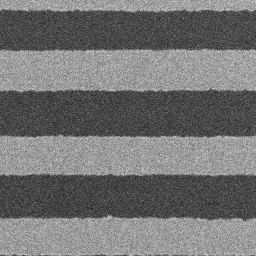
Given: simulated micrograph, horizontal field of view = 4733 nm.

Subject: one or a few lines or trenches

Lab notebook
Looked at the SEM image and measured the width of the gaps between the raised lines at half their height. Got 830 nanometres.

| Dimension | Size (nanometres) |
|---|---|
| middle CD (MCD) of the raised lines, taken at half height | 691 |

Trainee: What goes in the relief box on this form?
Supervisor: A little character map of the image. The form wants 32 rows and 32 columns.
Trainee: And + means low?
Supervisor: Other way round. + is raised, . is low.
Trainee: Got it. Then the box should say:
++++++++++++++++++++++++++++++++
................................
................................
................................
................................
................................
++++++++++++++++++++++++++++++++
++++++++++++++++++++++++++++++++
++++++++++++++++++++++++++++++++
++++++++++++++++++++++++++++++++
++++++++++++++++++++++++++++++++
................................
................................
................................
................................
................................
................................
++++++++++++++++++++++++++++++++
++++++++++++++++++++++++++++++++
++++++++++++++++++++++++++++++++
++++++++++++++++++++++++++++++++
++++++++++++++++++++++++++++++++
................................
................................
................................
................................
................................
++++++++++++++++++++++++++.+++.+
++++++++++++++++++++++++++++++++
++++++++++++++++++++++++++++++++
++++++++++++++++++++++++++++++++
++++++++++++++++++++++++++++++++